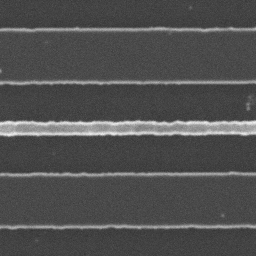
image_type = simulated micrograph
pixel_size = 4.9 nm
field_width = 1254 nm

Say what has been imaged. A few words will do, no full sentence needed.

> lines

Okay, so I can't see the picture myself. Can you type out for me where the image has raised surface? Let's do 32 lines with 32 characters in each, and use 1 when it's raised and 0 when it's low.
00000000000000000000000000000000
00000000000000000000000000000000
00000000000000000000000000000000
00000000000000000000000000000000
11111111111111111111111111111111
11111111111111111111111111111111
11111111111111111111111111111111
11111111111111111111111111111111
11111111111111111111111111111111
11111111111111111111111111111111
01110000000010000000000000000000
00000000000000000000000000000000
00000000000000000000000000000000
00000000000000000000000000000000
00000000000000000000000000000000
11111111111111111111111111111111
11111111111111111111111111111111
00000000000000000000000000000000
00000000000000000000000000000000
00000000000000000000000000000000
00000000000000000000000000000000
00000000000000000000000000000000
11111111111111111111111111111111
11111111111111111111111111111111
11111111111111111111111111111111
11111111111111111111111111111111
11111111111111111111111111111111
11111111111111111111111111111111
00000000000000000000000000000000
00000000000000000000000000000000
00000000000000000000000000000000
00000000000000000000000000000000